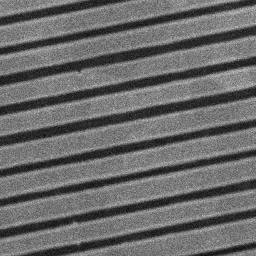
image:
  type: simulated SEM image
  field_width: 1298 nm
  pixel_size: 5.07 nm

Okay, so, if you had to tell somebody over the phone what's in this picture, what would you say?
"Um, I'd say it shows parallel lines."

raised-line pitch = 151 nanometers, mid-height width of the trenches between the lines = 59.8 nanometers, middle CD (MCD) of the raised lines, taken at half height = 90.2 nm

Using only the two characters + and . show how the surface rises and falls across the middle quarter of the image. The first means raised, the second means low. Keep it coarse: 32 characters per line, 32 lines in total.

...........+++++++++++++++++++++
......+++++++++++++++++++++++...
.+++++++++++++++++++++++........
++++++++++++++++++..............
+++++++++++++................+++
++++++++................++++++++
+++................+++++++++++++
..............++++++++++++++++++
........+++++++++++++++++++++++.
....++++++++++++++++++++++......
+++++++++++++++++++++...........
++++++++++++++++................
+++++++++++................+++++
++++++.................+++++++++
+.................++++++++++++++
............++++++++++++++++++++
........++++++++++++++++++++++++
..+++++++++++++++++++++++++.....
++++++++++++++++++++++..........
+++++++++++++++++..............+
+++++++++++...............++++++
++++++................++++++++++
+................+++++++++++++++
...........+++++++++++++++++++++
......++++++++++++++++++++++....
.++++++++++++++++++++++.........
+++++++++++++++++++.............
++++++++++++++..............++++
++++++++..............++++++++++
+++..............+++++++++++++++
............++++++++++++++++++++
.........+++++++++++++++++++++++